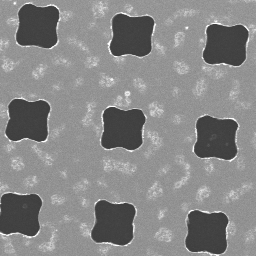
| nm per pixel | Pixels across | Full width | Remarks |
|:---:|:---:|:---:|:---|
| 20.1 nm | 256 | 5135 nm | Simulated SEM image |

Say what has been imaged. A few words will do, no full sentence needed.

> a regular array of holes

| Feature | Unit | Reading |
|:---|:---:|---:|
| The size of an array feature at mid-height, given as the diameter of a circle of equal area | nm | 901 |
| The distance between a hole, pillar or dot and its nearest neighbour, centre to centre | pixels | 93.9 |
